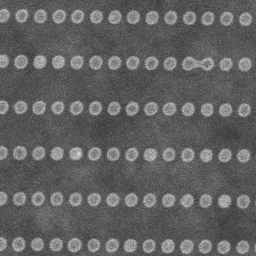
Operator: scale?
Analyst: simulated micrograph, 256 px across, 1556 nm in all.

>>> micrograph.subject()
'a regular array of raised bodies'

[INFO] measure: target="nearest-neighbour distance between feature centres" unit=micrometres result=0.113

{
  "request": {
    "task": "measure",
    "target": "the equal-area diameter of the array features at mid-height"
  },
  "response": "0.074 um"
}